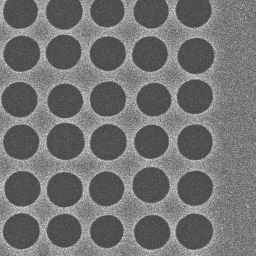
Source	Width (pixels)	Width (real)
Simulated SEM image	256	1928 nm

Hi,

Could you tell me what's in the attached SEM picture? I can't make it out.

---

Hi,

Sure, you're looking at a regular array of holes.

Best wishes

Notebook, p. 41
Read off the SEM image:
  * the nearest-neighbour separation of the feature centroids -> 318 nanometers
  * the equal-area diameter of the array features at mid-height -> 269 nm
